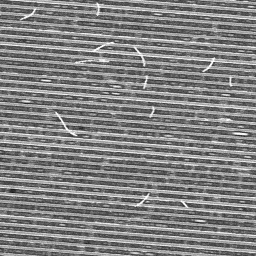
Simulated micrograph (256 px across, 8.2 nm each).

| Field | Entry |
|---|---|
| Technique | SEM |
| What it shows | parallel lines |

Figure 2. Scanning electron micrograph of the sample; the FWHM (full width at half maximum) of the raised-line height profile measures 2.49 px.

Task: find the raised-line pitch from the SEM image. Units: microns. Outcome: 0.0615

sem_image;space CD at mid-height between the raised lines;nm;41.8